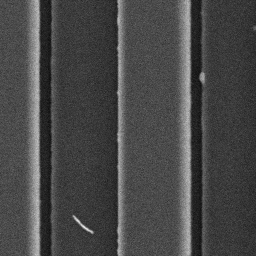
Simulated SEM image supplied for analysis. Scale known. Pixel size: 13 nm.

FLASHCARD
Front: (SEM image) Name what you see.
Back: lines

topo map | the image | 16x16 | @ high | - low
@@-----@@@@@----
@@-----@@@@@----
@@-----@@@@@----
@@-----@@@@@----
@@-----@@@@@----
@@-----@@@@@----
@@-----@@@@@----
@@-----@@@@@----
@@-----@@@@@----
@@-----@@@@@----
@@-----@@@@@----
@@-----@@@@@----
@@-----@@@@@----
@@-----@@@@@----
@@-----@@@@@----
@@-----@@@@@----